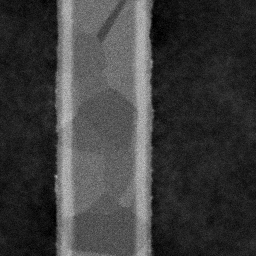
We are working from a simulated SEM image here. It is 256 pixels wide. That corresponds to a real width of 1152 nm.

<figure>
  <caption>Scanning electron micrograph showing one or a few lines or trenches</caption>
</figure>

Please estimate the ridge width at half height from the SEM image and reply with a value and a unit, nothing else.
337 nanometres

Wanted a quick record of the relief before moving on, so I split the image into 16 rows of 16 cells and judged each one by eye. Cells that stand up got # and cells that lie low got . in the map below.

....#####.......
....#####.......
....#####.......
....#####.......
....#####.......
....#####.......
....#####.......
....#####.......
....#####.......
....#####.......
....#####.......
....#####.......
....#####.......
....#####.......
....#####.......
....#####.......